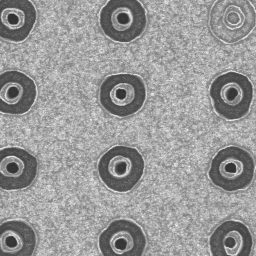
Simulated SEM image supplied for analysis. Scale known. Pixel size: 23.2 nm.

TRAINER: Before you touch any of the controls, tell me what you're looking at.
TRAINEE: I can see ring-shaped grooves with a dot in the middle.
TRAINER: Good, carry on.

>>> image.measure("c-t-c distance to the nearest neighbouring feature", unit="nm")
1710